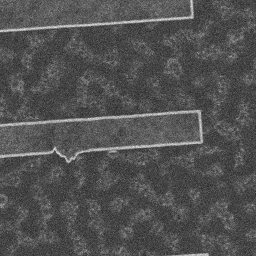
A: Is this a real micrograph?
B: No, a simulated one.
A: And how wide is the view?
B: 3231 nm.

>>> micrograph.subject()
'one or a few lines or trenches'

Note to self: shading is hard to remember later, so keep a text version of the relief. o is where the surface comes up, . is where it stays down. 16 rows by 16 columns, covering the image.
............oooo
.......ooooooooo
oooooooooooooooo
oooooooooooooooo
oooooooooooooooo
oooooooooooooooo
oooooooooooooooo
ooooo........ooo
.............ooo
.....ooooooooooo
oooooooooooooooo
oooooooooooooooo
oooooooooooooooo
oooooooooooooooo
oooooooooooooooo
oooooooooooooooo